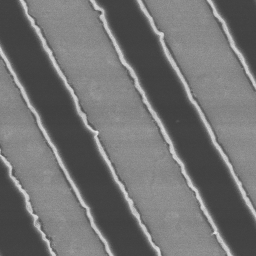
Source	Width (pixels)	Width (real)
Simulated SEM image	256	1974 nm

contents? one or a few lines or trenches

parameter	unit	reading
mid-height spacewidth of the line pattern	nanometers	469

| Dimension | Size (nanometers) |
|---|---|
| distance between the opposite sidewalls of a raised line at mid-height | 330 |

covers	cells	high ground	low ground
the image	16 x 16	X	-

XX----XXX----XXX
XX-----XXX----XX
XXX----XXX----XX
XXX-----XXX----X
-XXX----XXX----X
-XXX-----XXX----
--XXX----XXX----
--XXX-----XXX---
---XXX----XXX---
---XXX-----XXX--
X---XXX----XXX--
X---XXXX----XXX-
XX---XXX----XXX-
XX----XXX----XXX
XXX---XXX----XXX
XXX----XXX----XX